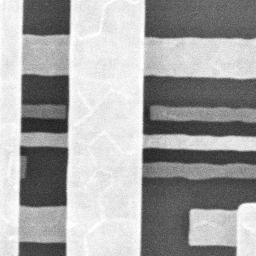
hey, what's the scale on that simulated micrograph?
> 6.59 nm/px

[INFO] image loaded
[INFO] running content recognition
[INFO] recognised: wiring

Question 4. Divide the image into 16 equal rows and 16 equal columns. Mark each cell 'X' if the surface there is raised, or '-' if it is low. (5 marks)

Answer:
X---XXXXX-------
X---XXXXX-------
X---XXXXX-------
X---XXXXX-------
X---XXXXX-------
X---XXXXX-------
X---XXXXX-------
X---XXXXX-------
X---XXXXX-------
X---XXXXX-------
X---XXXXX-------
X---XXXXX-------
X---XXXXX-------
X---XXXXX------X
X---XXXXX------X
X---XXXXX------X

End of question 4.